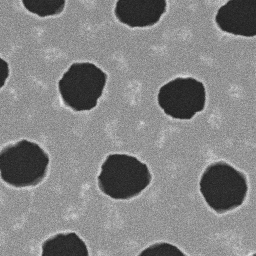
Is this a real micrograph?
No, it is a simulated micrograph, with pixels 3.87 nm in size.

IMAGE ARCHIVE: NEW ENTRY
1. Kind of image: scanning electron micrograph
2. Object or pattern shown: holes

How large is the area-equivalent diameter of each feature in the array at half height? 0.179 um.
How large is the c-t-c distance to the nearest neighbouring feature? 380 nanometres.